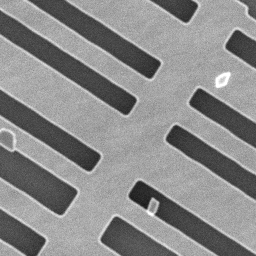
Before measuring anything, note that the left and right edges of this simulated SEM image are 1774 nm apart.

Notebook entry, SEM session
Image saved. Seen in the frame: groups of lines, slits or small figures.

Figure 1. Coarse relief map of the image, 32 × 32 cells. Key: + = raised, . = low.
++++.....++++++++++......+++++..
+++++.....+++++++++++...+++++++.
..+++++.....++++++++++..++++++++
....+++++.....++++++++++++++++++
.....+++++.....++++++++++++++..+
++.....+++++.....+++++++++++....
+++.....+++++.....+++++++++++...
+++++.....+++++.....++++++++++..
+++++++....+++++....++++++++++++
++++++++.....+++++.+++++++++++++
++++++++++....++++++++++++++++++
.++++++++++.....++++++++..++++++
..+++++++++++....+++++++....++++
....++++++++++...+++++++.....+++
.....+++++++++++++++++++++.....+
++.....++++++++++++++++++++.....
+++.....+++++++++++++...+++++...
+++++.....+++++++++++....+++++..
.+++++.....+++++++++++.....+++++
...+++++.....++++++++++.....++++
.....++++...+++++++++++++.....++
......+++++++++++++++++++++.....
........++++++++++++++++++++....
++.......++++++++..+++++++++++..
++++......++++++.....++++++++++.
+++++....++++++++..+..++++++++++
.++++++.+++++++++++.....++++++++
..++++++++++++..++++.....+++++++
....+++++++++....+++++.....+++++
.....++++++++......++++.....++++
+.....+++++++.......+++++.....++
++...+++++++++........++++......